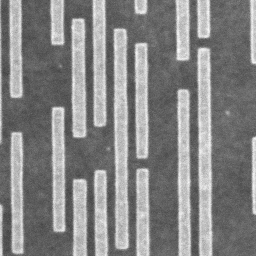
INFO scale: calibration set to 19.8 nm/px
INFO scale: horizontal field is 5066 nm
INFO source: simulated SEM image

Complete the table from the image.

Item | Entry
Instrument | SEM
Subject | wiring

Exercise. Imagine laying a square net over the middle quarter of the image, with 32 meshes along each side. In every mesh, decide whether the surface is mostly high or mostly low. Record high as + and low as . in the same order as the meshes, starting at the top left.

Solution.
..+++...++...++...+++...........
..+++...++...++...+++...........
..+++...++...++...+++...........
..+++...++...++...+++...........
..+++...++...++...+++...........
..+++...++...++...+++...........
..+++...++...++...+++...........
..+++...++...++...+++........++.
..+++...++...++...+++........++.
..+++...++...++...+++........++.
..+++...++...+++..+++........++.
..+++...++...+++..+++........++.
..+++...++...+++..+++........++.
..+++...++...+++..+++........++.
..+++...++...+++..+++........++.
..+++........+++..+++........++.
..+++........+++..+++........++.
..+++........+++..+++........++.
.............+++..+++........++.
.............+++..+++........++.
.............+++..+++........++.
.............+++..+++........++.
.............+++..+++........++.
.............++..............++.
.............++..............++.
.............++..............++.
.............+++...+.........++.
........++...+++..+++........++.
........++...+++..+++........++.
...++...++...+++..+++........++.
...++...++...+++..+++........++.
...++...++...+++..+++........++.